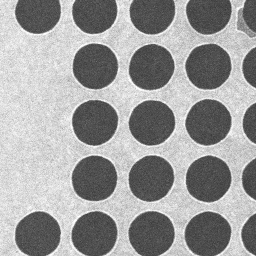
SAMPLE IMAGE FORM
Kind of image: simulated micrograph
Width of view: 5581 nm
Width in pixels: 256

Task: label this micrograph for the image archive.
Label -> a regular array of holes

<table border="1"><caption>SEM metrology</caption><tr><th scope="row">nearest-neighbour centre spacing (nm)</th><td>1220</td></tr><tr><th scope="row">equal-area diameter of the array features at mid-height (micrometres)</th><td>1.01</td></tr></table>